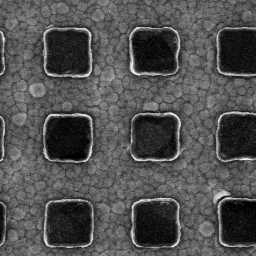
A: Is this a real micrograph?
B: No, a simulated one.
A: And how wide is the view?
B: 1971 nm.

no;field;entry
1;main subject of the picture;raised bodies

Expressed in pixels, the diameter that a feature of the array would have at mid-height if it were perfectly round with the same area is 52.6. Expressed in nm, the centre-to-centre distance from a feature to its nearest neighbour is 661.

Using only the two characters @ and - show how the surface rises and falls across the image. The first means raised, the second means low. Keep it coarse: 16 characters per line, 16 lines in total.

----------------
----------------
---@@@--@@@---@@
---@@@--@@@---@@
---@@@---@@---@@
----------------
----------------
---@@@--@@@---@@
---@@@--@@@---@@
---@@@--@@@---@@
----------------
----------------
---------@@---@@
---@@@--@@@---@@
---@@@--@@@---@@
----------------